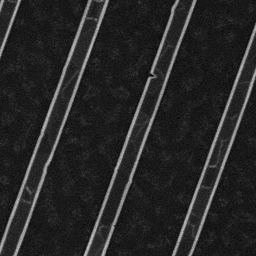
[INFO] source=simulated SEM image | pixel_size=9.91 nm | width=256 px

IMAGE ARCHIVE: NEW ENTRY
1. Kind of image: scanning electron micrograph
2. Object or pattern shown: one or a few lines or trenches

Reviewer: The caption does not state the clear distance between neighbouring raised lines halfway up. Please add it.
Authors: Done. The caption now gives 656 nanometres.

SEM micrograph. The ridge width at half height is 163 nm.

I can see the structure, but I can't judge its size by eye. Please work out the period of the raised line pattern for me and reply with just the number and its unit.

815 nm